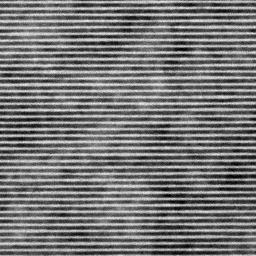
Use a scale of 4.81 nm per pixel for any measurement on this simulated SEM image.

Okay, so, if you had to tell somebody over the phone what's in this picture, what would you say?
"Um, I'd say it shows parallel lines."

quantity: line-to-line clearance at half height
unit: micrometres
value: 0.0241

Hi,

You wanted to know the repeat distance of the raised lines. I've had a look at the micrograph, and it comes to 30.6 nanometers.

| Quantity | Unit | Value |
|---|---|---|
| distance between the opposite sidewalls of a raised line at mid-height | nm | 6.6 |